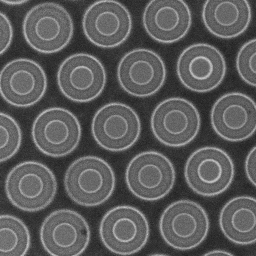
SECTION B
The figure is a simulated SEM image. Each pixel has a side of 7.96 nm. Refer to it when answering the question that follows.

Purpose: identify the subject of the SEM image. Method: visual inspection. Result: an array of small figures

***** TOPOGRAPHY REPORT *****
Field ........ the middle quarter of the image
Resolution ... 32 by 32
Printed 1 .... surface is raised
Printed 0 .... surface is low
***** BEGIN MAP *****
00000000011111000111110001111000
00111100001111001111110001111000
00111110001111000111110001111000
00111110001111000111110001111000
00111110001111000011100011111100
00011100001111100000000011111110
00000000011111110000000111111111
00000000111111111000011111111111
11000001111111111111111111111111
11111111111111111111111110000001
11111111111000011111111100000000
11111111100000000111111000000000
00111111000000000011110000111100
00011111000111100011110001111110
00011110001111110001110001111110
00001110001111110001110001111110
10001110001111110001110000111100
10001111000111100011111000000000
10001111000011000011111100000000
00011111100000000111111110000001
00011111110000001111111111111111
00111111111101111111111111111111
11111111111111111110000011111111
11111000111111111100000001111111
11100000001111111000000000111110
11000000000111110000010000011110
10000010000011110001111100011110
10001111100011110001111100011100
10001111100011110001111100011110
00001111100011110001111100011110
10001111100011110000111000011111
10000111000011111000000000111111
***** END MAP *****